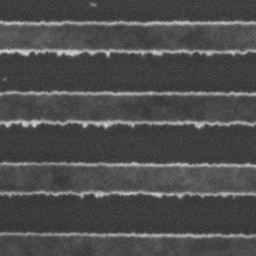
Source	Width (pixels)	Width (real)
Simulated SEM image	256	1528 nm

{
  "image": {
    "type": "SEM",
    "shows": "lines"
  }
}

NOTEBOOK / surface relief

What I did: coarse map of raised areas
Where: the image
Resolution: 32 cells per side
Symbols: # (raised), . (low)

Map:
................................
................................
................................
################################
################################
################################
###.###########################.
................................
................................
................................
................................
.#...#.#.....#..................
################################
################################
################################
......##...........###...####.##
................................
................................
................................
................................
###########.#...##..............
################################
################################
################################
................................
................................
................................
................................
................................
################################
################################
################################